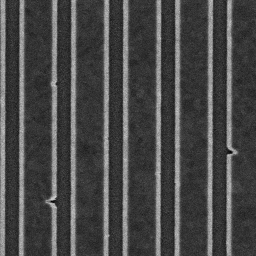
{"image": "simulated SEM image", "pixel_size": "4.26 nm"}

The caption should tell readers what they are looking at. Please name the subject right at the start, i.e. parallel lines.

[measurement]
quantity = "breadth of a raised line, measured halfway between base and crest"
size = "140 nm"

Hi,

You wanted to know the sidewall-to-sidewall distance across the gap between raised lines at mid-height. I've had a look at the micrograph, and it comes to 0.0793 µm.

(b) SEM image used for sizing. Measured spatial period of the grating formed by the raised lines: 0.221 µm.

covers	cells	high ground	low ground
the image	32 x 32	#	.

...####..####...####..####...###
...####..####...####..####...###
...####..####...####..####...###
...####..####...####..####...###
...####..####...####..####...###
...####..####...####..####...###
...####..####...####..####...###
...####..####...####..####...###
...####..####...####..####...###
...####..####...####..####...###
...####..####...####..####...###
...####..####...####..####...###
...####..####...####..####...###
...####..####...####..####...###
...####..####...####..####...###
...####..####...####..####...###
...####..####...####..####...###
...####..####...####..####...###
...####..####...####..####...###
...####..####...####..####...###
...####..####...####..####...###
...####..####...####..####...###
...####..####...####..####...###
...####..####...####..####...###
...####..####...####..####...###
...###...####...####..####...###
...####..####...####..####...###
...####..####...####..####...###
...####..####...####..####...###
...####..####...####..####...###
...####..####...####..####...###
...####..####...####..####...###